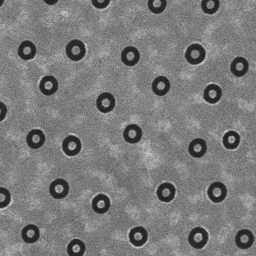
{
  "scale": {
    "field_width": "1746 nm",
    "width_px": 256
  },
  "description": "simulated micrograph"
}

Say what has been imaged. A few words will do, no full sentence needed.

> a regular array of ring-shaped grooves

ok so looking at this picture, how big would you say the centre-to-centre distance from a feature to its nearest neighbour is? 292 nm